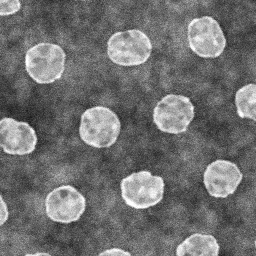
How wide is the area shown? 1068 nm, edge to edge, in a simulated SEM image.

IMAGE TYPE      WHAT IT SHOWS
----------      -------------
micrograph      a regular array of raised bodies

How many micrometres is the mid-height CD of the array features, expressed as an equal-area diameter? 0.161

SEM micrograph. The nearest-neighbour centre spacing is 325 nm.